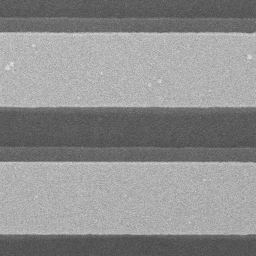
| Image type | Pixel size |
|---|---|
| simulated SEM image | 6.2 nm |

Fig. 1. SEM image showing lines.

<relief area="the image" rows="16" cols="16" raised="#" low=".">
................
................
################
################
################
################
################
................
................
................
################
################
################
################
################
................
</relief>